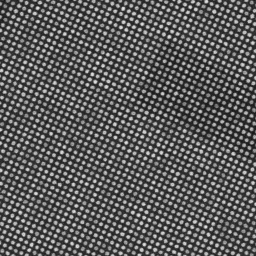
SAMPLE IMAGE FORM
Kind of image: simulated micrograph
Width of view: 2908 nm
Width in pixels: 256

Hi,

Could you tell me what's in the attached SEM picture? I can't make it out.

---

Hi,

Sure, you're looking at a regular array of raised bodies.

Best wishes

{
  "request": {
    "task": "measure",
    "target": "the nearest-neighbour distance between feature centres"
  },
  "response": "65.5 nm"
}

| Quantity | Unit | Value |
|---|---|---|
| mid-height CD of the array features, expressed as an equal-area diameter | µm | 0.0384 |